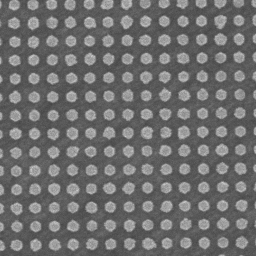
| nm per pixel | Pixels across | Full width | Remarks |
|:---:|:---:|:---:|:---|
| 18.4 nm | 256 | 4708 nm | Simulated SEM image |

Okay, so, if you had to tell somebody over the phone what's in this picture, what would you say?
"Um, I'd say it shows a regular array of raised bodies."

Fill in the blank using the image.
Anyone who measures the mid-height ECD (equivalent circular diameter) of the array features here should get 200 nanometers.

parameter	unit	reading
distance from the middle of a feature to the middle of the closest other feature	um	0.333